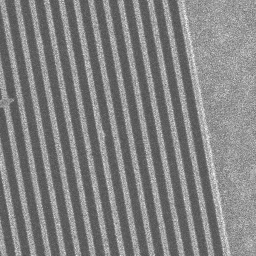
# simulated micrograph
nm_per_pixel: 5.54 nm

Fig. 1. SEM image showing parallel lines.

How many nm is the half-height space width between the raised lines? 43.7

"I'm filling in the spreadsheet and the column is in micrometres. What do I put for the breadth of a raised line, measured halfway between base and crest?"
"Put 0.0382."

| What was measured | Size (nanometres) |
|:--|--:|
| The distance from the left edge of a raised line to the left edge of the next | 80.8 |